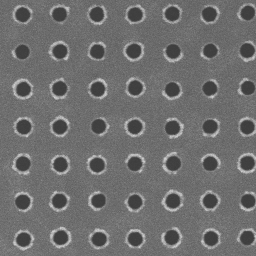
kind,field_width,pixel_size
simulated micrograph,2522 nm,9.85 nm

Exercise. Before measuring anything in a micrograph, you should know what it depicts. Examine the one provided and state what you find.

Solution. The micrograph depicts a regular array of holes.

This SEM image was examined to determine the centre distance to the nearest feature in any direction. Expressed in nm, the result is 360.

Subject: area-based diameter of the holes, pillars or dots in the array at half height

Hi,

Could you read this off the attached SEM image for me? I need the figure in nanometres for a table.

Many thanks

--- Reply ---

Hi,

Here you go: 146